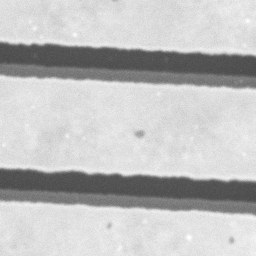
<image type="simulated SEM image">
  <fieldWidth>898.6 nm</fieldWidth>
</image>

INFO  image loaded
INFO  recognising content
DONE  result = lines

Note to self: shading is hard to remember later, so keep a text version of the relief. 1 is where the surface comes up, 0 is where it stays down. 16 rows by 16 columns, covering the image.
1111111111111111
1111111111111111
1111111111111111
0000000000000000
0000000000000000
1111111111111111
1111111111111111
1111111111111111
1111111111111111
1111111111111111
1111111111111111
0000000000000000
0000000000000000
1111111111111111
1111111111111111
1111111111111111